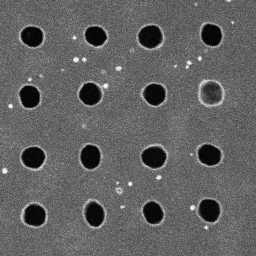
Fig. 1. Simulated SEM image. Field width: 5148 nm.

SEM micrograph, a regular array of holes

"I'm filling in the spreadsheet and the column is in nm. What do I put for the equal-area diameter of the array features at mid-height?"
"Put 442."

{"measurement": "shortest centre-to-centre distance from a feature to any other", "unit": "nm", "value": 1150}